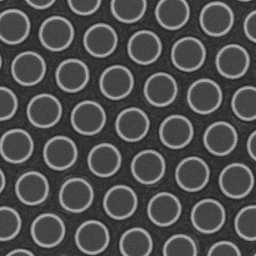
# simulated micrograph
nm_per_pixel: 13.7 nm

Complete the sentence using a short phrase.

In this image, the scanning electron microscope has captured a regular array of raised bodies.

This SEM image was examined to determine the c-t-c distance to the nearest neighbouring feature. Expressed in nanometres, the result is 610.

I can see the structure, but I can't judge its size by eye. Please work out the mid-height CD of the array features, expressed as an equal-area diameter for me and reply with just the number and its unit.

444 nm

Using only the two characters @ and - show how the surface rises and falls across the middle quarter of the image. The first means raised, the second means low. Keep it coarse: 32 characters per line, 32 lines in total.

@@@@@-----------------------@@@@
@@@@@@-----@@@@@---------------@
@@@@@@----@@@@@@@-------@-------
@@@@@@---@@@@@@@@----@@@@@@-----
@@@@@----@@@@@@@@----@@@@@@@----
@@@@@----@@@@@@@@---@@@@@@@@----
@@@@-----@@@@@@@@---@@@@@@@@---@
----------@@@@@@----@@@@@@@@---@
------------@@-------@@@@@@----@
-----@----------------@@@@@----@
---@@@@@@-----------------------
--@@@@@@@@------@@@-------------
--@@@@@@@@----@@@@@@------------
--@@@@@@@@---@@@@@@@@-----@@@@--
--@@@@@@@@---@@@@@@@@----@@@@@@-
--@@@@@@@@---@@@@@@@@---@@@@@@@@
---@@@@@@----@@@@@@@@---@@@@@@@@
-----@--------@@@@@@----@@@@@@@@
@--------------@@@@-----@@@@@@@@
@@-----------------------@@@@@@-
@@@------@@@--------------@@@@--
@@@----@@@@@@-------------------
@@@----@@@@@@@-----@@@@---------
@@@---@@@@@@@@----@@@@@@--------
@@----@@@@@@@@---@@@@@@@@----@@@
@@----@@@@@@@@---@@@@@@@@----@@@
-------@@@@@@----@@@@@@@@---@@@@
--------@@@@-----@@@@@@@@---@@@@
------------------@@@@@@----@@@@
-@@@@@--------------@@@------@@@
@@@@@@@----------------------@@@
@@@@@@@-----@@@@@--------------@